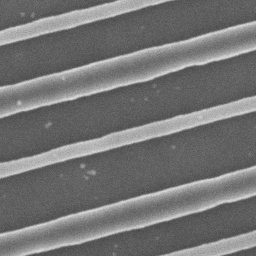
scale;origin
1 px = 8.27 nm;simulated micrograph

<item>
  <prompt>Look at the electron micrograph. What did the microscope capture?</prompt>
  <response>lines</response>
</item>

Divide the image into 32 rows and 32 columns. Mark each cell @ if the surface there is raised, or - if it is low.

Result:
-------------@@@@@@@------------
---------@@@@@@@----------------
-----@@@@@@@--------------------
-@@@@@@@@--------------------@@@
@@@@@--------------------@@@@@@@
@--------------------@@@@@@@@@@@
-----------------@@@@@@@@@@@@@@-
-------------@@@@@@@@@@@@@@-----
----------@@@@@@@@@@@@@---------
------@@@@@@@@@@@@@@------------
--@@@@@@@@@@@@@@----------------
@@@@@@@@@@@@--------------------
@@@@@@@@@---------------------@@
@@@@----------------------@@@@@@
@---------------------@@@@@@@---
-------------------@@@@@@@------
---------------@@@@@@@----------
------------@@@@@@--------------
-------@@@@@@@------------------
----@@@@@@----------------------
@@@@@@--------------------------
@@@--------------------------@@@
-------------------------@@@@@@@
----------------------@@@@@@@@@@
------------------@@@@@@@@@@@@@@
--------------@@@@@@@@@@@@@-----
-----------@@@@@@@@@@@@@@-------
-------@@@@@@@@@@@@@@-----------
---@@@@@@@@@@@@@@---------------
@@@@@@@@@@@@@-----------------@@
@@@@@@@@@@----------------@@@@@@
@@@@@-----------------@@@@@@@---